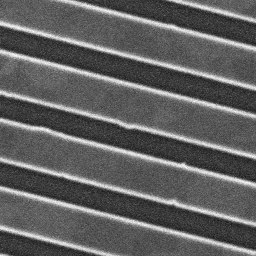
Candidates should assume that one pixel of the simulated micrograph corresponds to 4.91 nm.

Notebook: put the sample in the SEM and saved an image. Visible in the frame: one or a few lines or trenches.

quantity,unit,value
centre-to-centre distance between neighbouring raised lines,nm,324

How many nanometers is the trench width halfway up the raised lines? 125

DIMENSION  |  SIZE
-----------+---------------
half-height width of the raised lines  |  194 nm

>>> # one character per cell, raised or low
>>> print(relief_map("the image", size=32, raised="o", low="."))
oooooooooo..............oooooooo
oooooooooooooo..............oooo
oooooooooooooooooo.............o
..oooooooooooooooooooo..........
......oooooooooooooooooooo......
..........oooooooooooooooooooo..
..............oooooooooooooooooo
oooo..............oooooooooooooo
oooooooo..............oooooooooo
oooooooooooo..............oooooo
oooooooooooooooo.............ooo
oooooooooooooooooooo............
....oooooooooooooooooooo........
........oooooooooooooooooooo....
............oooooooooooooooooooo
oo.............ooooooooooooooooo
ooooooo.............oooooooooooo
oooooooooo..............oooooooo
oooooooooooooo.............ooooo
oooooooooooooooooo.............o
..oooooooooooooooooooo..........
......oooooooooooooooooooo......
..........oooooooooooooooooooo..
..............oooooooooooooooooo
oooo..............oooooooooooooo
oooooooo..............oooooooooo
oooooooooooo.............ooooooo
oooooooooooooooo.............ooo
oooooooooooooooooooo............
....oooooooooooooooooooo........
........oooooooooooooooooooo....
............oooooooooooooooooooo